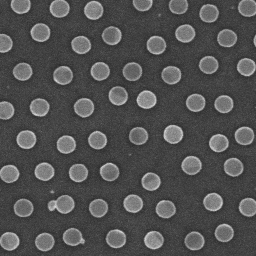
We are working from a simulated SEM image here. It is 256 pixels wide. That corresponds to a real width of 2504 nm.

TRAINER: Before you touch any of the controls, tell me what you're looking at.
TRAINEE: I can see a regular array of raised bodies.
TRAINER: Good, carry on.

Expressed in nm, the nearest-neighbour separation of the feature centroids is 307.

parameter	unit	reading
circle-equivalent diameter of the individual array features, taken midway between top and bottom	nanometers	180